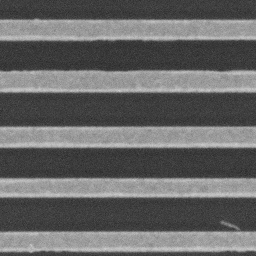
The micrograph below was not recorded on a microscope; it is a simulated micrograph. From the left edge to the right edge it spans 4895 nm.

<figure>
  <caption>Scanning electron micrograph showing lines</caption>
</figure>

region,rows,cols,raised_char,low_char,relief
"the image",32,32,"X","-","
--------------------------------
--------------------------------
----X---------------------------
XXXXXXXXXXXXXXXXXXXXXXXXXXXXXXXX
XXXXXXXXXXXXXXXXXXXXXXXXXXXXXXXX
--------------------------------
--------------------------------
--------------------------------
--------------------------------
XXXXXXXXXXXXXXXXXXXXXXXXXXXXXXXX
XXXXXXXXXXXXXXXXXXXXXXXXXXXXXXXX
--------------------------------
--------------------------------
--------------------------------
--------------------------------
--------------------------------
XXXXXXXXXXXXXXXXXXXXXXXXXXXXXXXX
XXXXXXXXXXXXXXXXXXXXXXXXXXXXXXXX
--------------------------------
--------------------------------
--------------------------------
--------------------------------
XXXXXXXXXXXXXXXXXXXXXXXXXXXXXXXX
XXXXXXXXXXXXXXXXXXXXXXXXXXXXXXXX
----------XX--------------------
--------------------------------
--------------------------------
--------------------------------
--------------------------------
XXXXXXXXXXXXXXXXXXXXXXXXXXXXXXXX
XXXXXXXXXXXXXXXXXXXXXXXXXXXXXXXX
--------------------------------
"